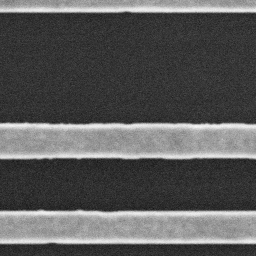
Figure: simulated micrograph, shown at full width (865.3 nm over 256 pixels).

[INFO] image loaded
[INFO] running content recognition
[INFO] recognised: lines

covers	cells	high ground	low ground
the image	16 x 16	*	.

****************
................
................
................
................
................
................
................
****************
****************
................
................
................
****************
****************
................